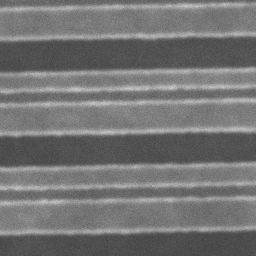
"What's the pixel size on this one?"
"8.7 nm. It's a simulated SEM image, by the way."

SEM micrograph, lines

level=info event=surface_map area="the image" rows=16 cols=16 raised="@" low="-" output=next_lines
@@@@@@@@@@@@@@@@
@@@@@@@@@@@@@@@@
----------------
----------------
-----@@@@@@@@@@@
@@@@@@@@@@@@@@@@
@@@@@@@@@@@@@@@@
@@@@@@@@@@@@@@@@
----------------
----------------
-@@@@@@@@@@@@@@@
@@@@@@@@@@@@@@@@
@@@@@@@@@@@@@@@@
@@@@@@@@@@@@@@@@
@@@@@@@@--------
----------------